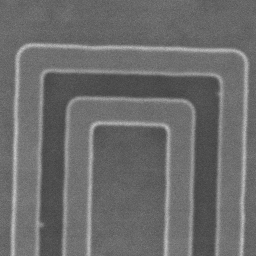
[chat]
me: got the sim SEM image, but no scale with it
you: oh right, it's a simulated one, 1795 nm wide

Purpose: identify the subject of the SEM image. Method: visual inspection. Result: groups of lines, slits or small figures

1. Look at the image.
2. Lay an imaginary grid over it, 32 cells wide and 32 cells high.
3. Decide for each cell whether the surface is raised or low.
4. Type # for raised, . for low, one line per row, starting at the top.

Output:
................................
................................
................................
................................
................................
................................
..############################..
..#############################.
..#############################.
..###......................####.
..###.......................###.
..###.......................###.
..###....##############.....###.
..###....###############....###.
..###...################...####.
..###...####.....#######...####.
..###...###..........###...####.
..###...###..........###...####.
..###...###..........###...####.
..###...###..........###...####.
..###...###..........###...####.
..###...###..........###...###..
..###...###..........###...###..
..###...###..........###...###..
..###...###..........###...###..
..###...###..........###...###..
..###...###..........###...###..
..###...###..........###...###..
..###...###..........###...###..
..###...###..........###...###..
..###...###..........###...###..
..###...###..........###...###..